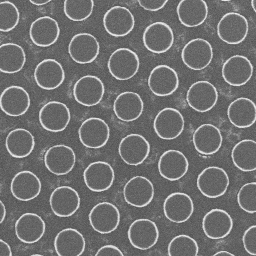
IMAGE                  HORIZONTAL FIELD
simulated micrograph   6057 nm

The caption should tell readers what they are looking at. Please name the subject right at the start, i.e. a regular array of raised bodies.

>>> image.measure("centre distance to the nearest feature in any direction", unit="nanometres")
998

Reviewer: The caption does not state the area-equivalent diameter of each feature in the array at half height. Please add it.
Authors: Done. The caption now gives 694 nanometres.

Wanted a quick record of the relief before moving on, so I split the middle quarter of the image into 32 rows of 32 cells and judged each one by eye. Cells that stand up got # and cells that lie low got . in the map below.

...........########............#
...........#######....#####.....
............######....######....
.....###.....###.....#######....
...######............#######....
...#######...........#######....
...#######............#####....#
...#######.....###.....###.....#
...######....######............#
....#####....######............#
.............#######............
#............######......##.....
#............######.....#####...
#.............####.....#######..
#....#####.............#######..
#...#######............#######..
....#######............######...
....#######.............#####...
....#######....#####.....##.....
.....#####....#######...........
......###.....#######...........
##............#######...........
##............#######....####...
###............#####....######..
###.............###.....#######.
##....#####.............#######.
##...#######............#######.
.....#######............######..
.....#######.....###......###...
......######....#####...........
......#####....#######..........
##.....###.....#######..........